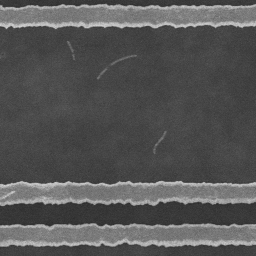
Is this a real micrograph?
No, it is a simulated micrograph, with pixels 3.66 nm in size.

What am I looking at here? lines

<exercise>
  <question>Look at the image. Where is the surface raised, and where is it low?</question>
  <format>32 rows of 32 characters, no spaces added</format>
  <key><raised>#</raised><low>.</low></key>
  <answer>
................................
################################
################################
................................
................................
................................
................................
................................
................................
................................
................................
................................
................................
................................
................................
................................
................................
................................
................................
................................
................................
................................
................................
################################
################################
#................#..............
................................
................................
################################
################################
###############.################
................................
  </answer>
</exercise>